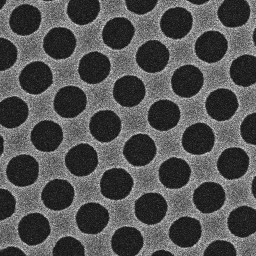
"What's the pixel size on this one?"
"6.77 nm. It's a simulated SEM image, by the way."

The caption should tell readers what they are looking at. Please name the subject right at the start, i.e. a regular array of holes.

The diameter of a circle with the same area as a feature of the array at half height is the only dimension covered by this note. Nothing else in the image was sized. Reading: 224 nanometers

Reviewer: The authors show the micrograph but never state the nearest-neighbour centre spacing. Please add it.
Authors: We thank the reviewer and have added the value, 282 nm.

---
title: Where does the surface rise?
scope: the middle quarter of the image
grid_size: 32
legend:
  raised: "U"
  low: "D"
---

UUUUDDDDDDDDUUUUUUUDDDDDDDUUUDDD
UUUDDDDDDDDDUUUUUUUUDDDDDUUUDDDD
UUUUDDDDDDDUUUUUUUUUUUUUUUUDDDDD
UUUUDDDDDDDUUUDDDDDUUUUUUUUDDDDD
UUUUUDDDDUUUUDDDDDDDUUUUUUUDDDDD
UDDUUUUUUUUUDDDDDDDDUUUUUUUDDDDD
DDDDDUUUUUUUDDDDDDDDUUUUUUUDDDDD
DDDDDUUUUUUUDDDDDDDDUUUUUUUUDDDD
DDDDDDUUUUUUDDDDDDDDUUUUUUUUUUDU
DDDDDDUUUUUUUDDDDDDUUUUDDDDUUUUU
DDDDDDUUUUUUUUDDDDUUUUDDDDDDUUUU
DDDDDUUUUUDUUUUUUUUUUDDDDDDDDUUU
DDDDUUUUDDDDDUUUUUUUUDDDDDDDDUUU
DDUUUUUDDDDDDDUUUUUUUDDDDDDDDUUU
UUUUUUDDDDDDDDUUUUUUUDDDDDDDDUUU
UUUUUUDDDDDDDDUUUUUUUUDDDDDDUUUD
UUUUUUDDDDDDDDUUUUUUUUUDDDUUUUDD
UUUUUUUDDDDDDDUUUUDDDUUUUUUUUUDD
UUUUUUUUDDDDDUUUDDDDDDUUUUUUUDDD
UUUUUUUUUDDUUUUUDDDDDDDUUUUUUDDD
UUUDDDDUUUUUUUUDDDDDDDDUUUUUUUDD
UDDDDDDDUUUUUUUDDDDDDDDUUUUUUUDD
UDDDDDDDUUUUUUUDDDDDDDDUUUUUUUUU
DDDDDDDDUUUUUUUDDDDDDDDUUUDDDUUU
DDDDDDDDDUUUUUUUDDDDDDUUUDDDDDDU
DDDDDDDDUUUUUUUUUDDDUUUUDDDDDDDU
UDDDDDDDUUUDDDDUUUUUUUUUDDDDDDDD
UUDDDDUUUUDDDDDDUUUUUUUUDDDDDDDD
UUUUUUUUUDDDDDDDDUUUUUUUDDDDDDDU
DUUUUUUUUDDDDDDDDUUUUUUUDDDDDDDU
DDUUUUUUUDDDDDDDDUUUUUUUUDDDDDUU
DDDUUUUUUDDDDDDDDUUUUUUUUUUUUUUU